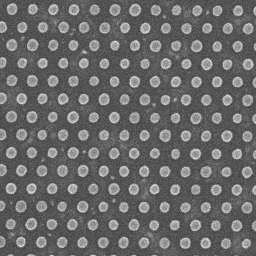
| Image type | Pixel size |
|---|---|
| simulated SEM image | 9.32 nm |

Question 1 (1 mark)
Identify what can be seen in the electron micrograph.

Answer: a regular array of raised bodies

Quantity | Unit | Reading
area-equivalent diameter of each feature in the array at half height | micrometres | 0.0908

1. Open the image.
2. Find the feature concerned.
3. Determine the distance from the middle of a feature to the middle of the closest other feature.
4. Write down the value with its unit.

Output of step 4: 20.3 pixels